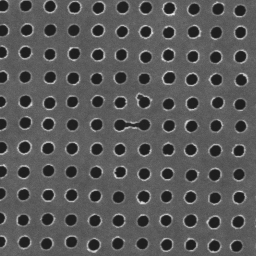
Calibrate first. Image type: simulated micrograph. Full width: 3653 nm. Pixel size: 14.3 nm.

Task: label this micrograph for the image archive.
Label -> a regular array of holes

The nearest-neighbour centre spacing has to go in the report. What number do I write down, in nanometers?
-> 325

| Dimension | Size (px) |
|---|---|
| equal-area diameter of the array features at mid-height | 11.5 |